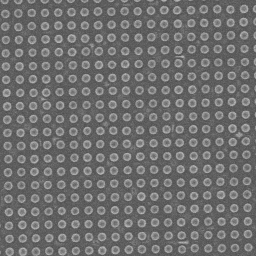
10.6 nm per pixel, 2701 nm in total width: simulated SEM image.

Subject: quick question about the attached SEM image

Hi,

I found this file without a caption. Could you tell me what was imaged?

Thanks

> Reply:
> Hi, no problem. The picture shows a regular array of raised bodies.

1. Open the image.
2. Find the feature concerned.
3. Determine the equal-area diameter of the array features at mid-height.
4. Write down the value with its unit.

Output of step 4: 84.2 nm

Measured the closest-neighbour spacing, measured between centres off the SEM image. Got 136 nm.